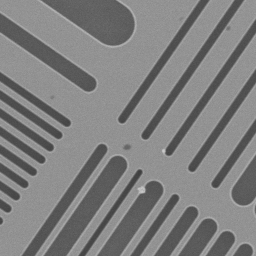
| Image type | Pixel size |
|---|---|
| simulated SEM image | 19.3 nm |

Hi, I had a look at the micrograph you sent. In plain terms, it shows groups of lines, slits or small figures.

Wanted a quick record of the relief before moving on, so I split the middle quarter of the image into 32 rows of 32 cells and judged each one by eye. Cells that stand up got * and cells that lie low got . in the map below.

...********************..******.
.....*****************..******..
......***************...******..
........************...******...
**......************..******...*
***.....***********...******..**
*****...**********...******...**
******************..******...***
*****************...*****...****
****************...******...****
****************..******...*****
***************...******..******
**************...******..******.
.*************..******...******.
..************.******...******..
.********************..******...
********************...******..*
*******************...******...*
*******************..******...**
***************************..***
********...***************...***
********...**************...****
*******....**************..*****
******....**...*****************
******...**.....****************
*****...**......***************.
****....*.......***************.
***....**......***..************
***...**......***..*************
**....*.......**..***...********
*....**......***.***.....*******
*...**......***..***.....*******